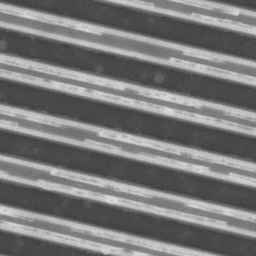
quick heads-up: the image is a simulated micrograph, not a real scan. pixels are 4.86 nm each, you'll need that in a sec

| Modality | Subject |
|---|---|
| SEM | parallel lines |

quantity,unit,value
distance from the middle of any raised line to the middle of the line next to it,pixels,49.2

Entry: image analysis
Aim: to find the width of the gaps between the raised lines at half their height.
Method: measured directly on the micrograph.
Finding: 150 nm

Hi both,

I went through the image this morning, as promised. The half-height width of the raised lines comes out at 0.0858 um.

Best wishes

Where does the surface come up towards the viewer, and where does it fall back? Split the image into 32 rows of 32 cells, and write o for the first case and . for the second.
.................ooooooooo......
oooo.................ooooooooo..
oooooooo.................ooooooo
..oooooooooo..................oo
.......ooooooooo................
...........ooooooooo............
...............oooooooooo.......
oo..................ooooooooo...
oooooo..................oooooooo
.oooooooooo.................oooo
.....oooooooooo.................
..........ooooooooo.............
..............oooooooooo........
..................oooooooooo....
ooooo..................ooooooooo
ooooooooo..................ooooo
....ooooooooo..................o
........ooooooooooo.............
.............ooooooooo..........
.................ooooooooo......
ooo..................oooooooooo.
oooooooo.................ooooooo
...ooooooooo..................oo
.....ooooooooooo................
..........oooooooooo............
................ooooooooo.......
oo.................ooooooooooo..
ooooooo.................oooooooo
.oooooooooo..................ooo
.....oooooooooo.................
..........ooooooooo.............
.............ooooooooooo........